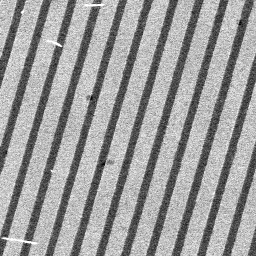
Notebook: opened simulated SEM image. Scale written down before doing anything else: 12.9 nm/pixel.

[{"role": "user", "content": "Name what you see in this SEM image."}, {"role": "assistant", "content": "parallel lines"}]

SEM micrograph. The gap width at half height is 112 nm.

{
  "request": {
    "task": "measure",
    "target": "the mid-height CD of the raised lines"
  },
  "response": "0.2 microns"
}